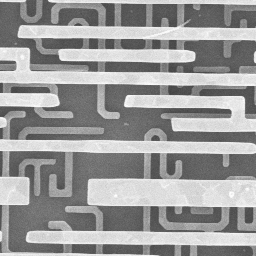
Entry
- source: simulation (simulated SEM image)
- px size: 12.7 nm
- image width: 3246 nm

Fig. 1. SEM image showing wiring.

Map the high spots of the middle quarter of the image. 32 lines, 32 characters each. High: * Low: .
................................
................................
********************************
********************************
********************************
................................
................................
................................
...............*****************
...............*****************
...............*****************
................................
................................
................................
...........................*****
...........................*****
...........................*****
................................
................................
**************************......
********************************
********************************
................................
................................
................................
................................
................................
................................
................................
......**************************
......**************************
......**************************